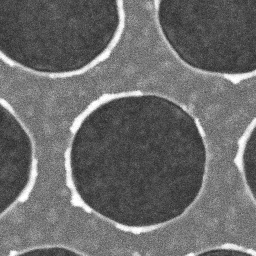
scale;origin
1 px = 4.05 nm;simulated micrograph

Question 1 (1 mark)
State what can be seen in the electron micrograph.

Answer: holes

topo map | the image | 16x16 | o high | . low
.......ooo......
.......ooo......
.......ooo......
......ooooo.....
oo..ooooooooo...
oooooooooooooooo
oooooo.....ooooo
.oooo.......oooo
..ooo........ooo
..oo.........oo.
..oo.........oo.
..ooo........oo.
.oooo.......oooo
oooooo.....ooooo
oooooooooooooooo
ooo.oooooooooooo